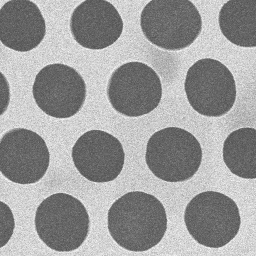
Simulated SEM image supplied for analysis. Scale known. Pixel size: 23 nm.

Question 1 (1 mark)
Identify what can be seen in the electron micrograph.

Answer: a regular array of holes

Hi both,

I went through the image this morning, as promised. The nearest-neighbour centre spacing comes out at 1730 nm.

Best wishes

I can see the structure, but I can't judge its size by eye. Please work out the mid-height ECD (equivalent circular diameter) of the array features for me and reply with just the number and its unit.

1.28 micrometres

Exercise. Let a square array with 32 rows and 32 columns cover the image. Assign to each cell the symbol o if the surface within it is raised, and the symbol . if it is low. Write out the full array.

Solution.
o...oooooo....oooo......oooo....
.....oooo......ooo.......ooo....
......ooo......ooo.......oo.....
......ooo......ooo.......ooo....
.....oooo......ooo.......ooo....
.....ooooo....ooooo.....ooooo...
oooooooooooooooooooooooooooooooo
ooooooooooooooooooooooooo..ooooo
ooooo....oooooo....ooooo....oooo
.oooo.....oooo......ooo......ooo
.ooo.......oo.......ooo......ooo
.ooo.......oo.......ooo.......oo
.ooo.......ooo......oooo.....ooo
.oooo.....oooo.....ooooo.....ooo
oooooo...ooooooo.ooooooooo.ooooo
oooooooooooooooooooooooooooooooo
o...ooooooo..oooooo.....ooooo...
.....ooooo.....oooo......ooo....
......ooo......ooo.......ooo....
......ooo.......oo.......ooo....
......ooo......ooo.......ooo....
......oooo.....oooo.....ooooo...
o....oooooo...oooooo...ooooooooo
oooooooooooooooooooooooooooooooo
oooooo...oooooo....ooooo....oooo
.oooo.....oooo......ooo.......oo
.ooo.......ooo.......oo.......oo
..oo.......oo........oo.......oo
..oo.......ooo.......oo.......oo
.oooo......ooo......oooo.....ooo
.ooooo....ooooo.....ooooo...oooo
oooooooooooooooooooooooooooooooo